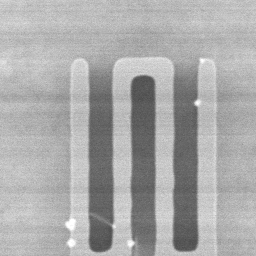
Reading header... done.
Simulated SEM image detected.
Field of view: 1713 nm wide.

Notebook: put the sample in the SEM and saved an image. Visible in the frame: groups of lines, slits or small figures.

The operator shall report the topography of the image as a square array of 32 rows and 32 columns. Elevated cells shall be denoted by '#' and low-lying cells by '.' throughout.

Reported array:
................................
................................
................................
................................
................................
................................
................................
...............######....#......
.........##...########...##.....
.........##...###..###...##.....
.........##...##...###...##.....
.........##...##...###...##.....
.........##...##...###...##.....
.........##...##...###...##.....
.........##...##...###...##.....
.........##...##...###...##.....
.........##...##...###...##.....
.........##...##...###...##.....
.........##...##...###...##.....
.........##...##...###...##.....
.........##...##...###...##.....
.........##...##....##...##.....
.........##...##...###...##.....
.........##...##...###...##.....
.........##...##...###...##.....
.........##...##...###...##.....
.........##...##...###...##.....
.........##...##....##...##.....
.........##...##....##...##.....
.........##...##....##...##.....
.........##...###..###...##.....
.........###.###...########.....